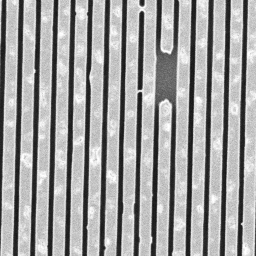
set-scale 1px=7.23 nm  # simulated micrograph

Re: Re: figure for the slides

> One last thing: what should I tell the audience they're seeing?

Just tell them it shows parallel lines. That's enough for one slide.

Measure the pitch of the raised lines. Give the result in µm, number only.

0.125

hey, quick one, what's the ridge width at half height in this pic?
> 87.6 nm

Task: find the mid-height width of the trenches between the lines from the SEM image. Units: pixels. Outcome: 4.62